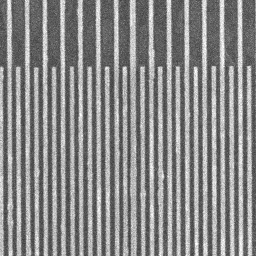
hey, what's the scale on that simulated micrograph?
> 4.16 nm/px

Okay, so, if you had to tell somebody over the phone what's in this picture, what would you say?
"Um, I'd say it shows parallel lines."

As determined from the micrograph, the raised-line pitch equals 8.87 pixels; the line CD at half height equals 17.7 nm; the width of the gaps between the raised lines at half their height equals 20.8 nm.